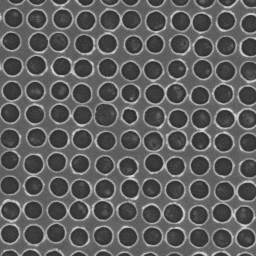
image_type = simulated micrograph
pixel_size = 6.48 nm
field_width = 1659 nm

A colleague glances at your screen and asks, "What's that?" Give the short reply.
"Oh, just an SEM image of a regular array of holes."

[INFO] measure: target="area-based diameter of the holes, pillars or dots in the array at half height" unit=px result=18.8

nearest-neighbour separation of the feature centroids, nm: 147